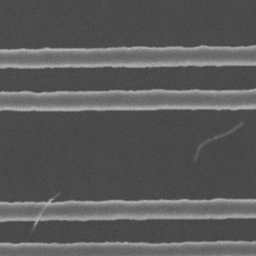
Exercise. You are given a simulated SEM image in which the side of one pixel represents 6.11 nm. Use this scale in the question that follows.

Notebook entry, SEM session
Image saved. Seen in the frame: lines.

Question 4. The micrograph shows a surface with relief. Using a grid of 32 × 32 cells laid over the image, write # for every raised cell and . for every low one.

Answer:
................................
................................
................................
................................
................................
................................
################################
################################
................................
................................
................................
#.##...#########################
################################
####################.##########.
................................
................................
................................
................................
................................
................................
................................
................................
................................
................................
................................
################################
################################
#####...........................
................................
................................
######...##########.############
################################